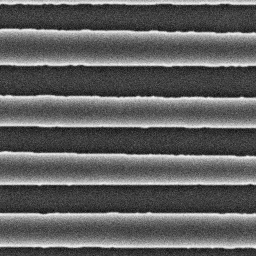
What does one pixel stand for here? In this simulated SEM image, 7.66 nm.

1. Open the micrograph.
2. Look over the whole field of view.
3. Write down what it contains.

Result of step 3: lines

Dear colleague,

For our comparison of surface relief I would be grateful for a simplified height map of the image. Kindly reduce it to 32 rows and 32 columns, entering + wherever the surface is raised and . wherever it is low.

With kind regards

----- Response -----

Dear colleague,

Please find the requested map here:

................................
................................
................................
................................
++++++++++++++++++++++++++++++++
++++++++++++++++++++++++++++++++
++++++++++++++++++++++++++++++++
++++++++++++++++++++++++++++++++
................................
................................
................................
................................
++++++++++++++++++++++++++++++++
++++++++++++++++++++++++++++++++
++++++++++++++++++++++++++++++++
++++++++++++++++++++++++++++++++
................................
................................
................................
++++++++++++++++++++++++........
++++++++++++++++++++++++++++++++
++++++++++++++++++++++++++++++++
++++++++++++++++++++++++++++++++
................................
................................
................................
................................
++++++++++++++++++++++++++++++++
++++++++++++++++++++++++++++++++
++++++++++++++++++++++++++++++++
++++++++++++++++++++++++++++++++
................................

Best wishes